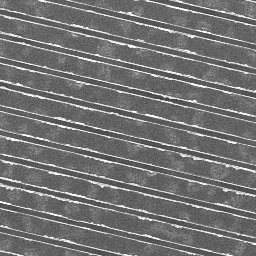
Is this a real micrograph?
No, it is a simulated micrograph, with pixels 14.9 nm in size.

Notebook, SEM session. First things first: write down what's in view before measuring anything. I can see parallel lines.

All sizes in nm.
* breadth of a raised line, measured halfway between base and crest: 264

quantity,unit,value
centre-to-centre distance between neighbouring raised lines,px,23.6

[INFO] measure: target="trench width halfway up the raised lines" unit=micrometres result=0.0797